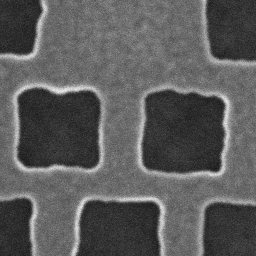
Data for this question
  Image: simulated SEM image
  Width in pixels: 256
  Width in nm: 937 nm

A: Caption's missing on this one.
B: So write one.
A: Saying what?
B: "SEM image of holes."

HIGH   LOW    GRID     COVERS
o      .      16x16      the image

...oooooooooo...
..ooooooooooo...
..ooooooooooo...
ooooooooooooo...
oooooooooooooooo
oo.ooooooooooooo
o.....ooo.....oo
o.....ooo.....oo
o.....ooo.....oo
o.....ooo.....oo
ooooo.ooo.....oo
oooooooooooooooo
..oooooooooooooo
..ooo.....ooo...
..ooo.....ooo...
..ooo.....ooo...